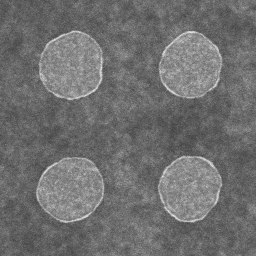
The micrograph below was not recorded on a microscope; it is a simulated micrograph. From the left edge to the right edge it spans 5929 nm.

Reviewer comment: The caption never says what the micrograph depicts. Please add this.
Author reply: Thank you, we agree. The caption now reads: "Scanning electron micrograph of raised bodies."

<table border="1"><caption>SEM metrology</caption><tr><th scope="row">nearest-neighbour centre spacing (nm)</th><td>2760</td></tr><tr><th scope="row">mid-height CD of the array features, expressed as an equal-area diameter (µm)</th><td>1.48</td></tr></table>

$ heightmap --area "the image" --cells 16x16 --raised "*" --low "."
................
................
...***.....**...
...***....****..
..****....****..
...***.....**...
................
................
................
................
...***....***...
..****....****..
..****....****..
...**......**...
................
................